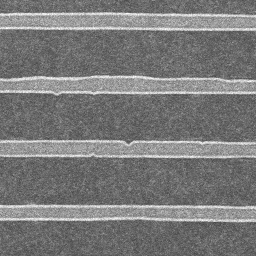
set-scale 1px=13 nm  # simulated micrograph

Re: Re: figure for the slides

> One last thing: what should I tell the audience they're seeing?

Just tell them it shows one or a few lines or trenches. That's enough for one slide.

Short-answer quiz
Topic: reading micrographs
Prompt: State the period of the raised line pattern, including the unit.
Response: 63.8 px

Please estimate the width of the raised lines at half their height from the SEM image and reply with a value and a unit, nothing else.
13.6 px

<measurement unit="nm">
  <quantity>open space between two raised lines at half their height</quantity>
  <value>646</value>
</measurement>